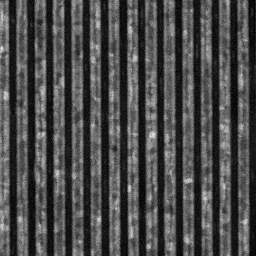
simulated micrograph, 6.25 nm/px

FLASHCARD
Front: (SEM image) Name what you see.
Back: parallel lines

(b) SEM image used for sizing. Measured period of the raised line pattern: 115 nm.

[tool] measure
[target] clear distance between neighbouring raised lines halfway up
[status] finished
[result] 0.0586 microns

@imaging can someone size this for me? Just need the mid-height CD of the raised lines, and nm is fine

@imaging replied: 53.1